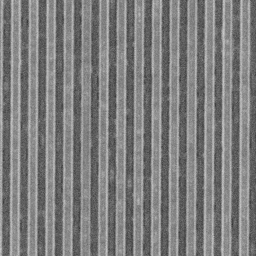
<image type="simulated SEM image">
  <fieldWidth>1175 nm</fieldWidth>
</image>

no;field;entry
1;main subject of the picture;parallel lines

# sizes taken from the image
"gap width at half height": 10.3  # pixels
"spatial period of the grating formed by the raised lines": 80.9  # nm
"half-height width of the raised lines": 0.0345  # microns